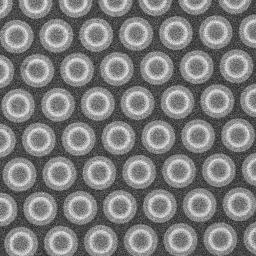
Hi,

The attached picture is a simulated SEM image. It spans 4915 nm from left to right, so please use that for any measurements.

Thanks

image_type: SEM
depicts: an array of small figures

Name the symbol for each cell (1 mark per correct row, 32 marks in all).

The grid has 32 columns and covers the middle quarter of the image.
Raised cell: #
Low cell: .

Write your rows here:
#######..########..########..###
#######..########..########..###
#######..########..########..###
#######...#######...#######...##
######.....#####.....####......#
..###......................##...
......#####.....#####.....#####.
##...#######...#######...#######
##...#######..########..########
###.#########.########..########
###.#########.########..########
##...#######...#######...#######
##...#######...#######...######.
#.....#####......###.......###..
............###.......###......#
.#####.....######...#######...##
#######...#######...#######...##
########..########..########.###
########..########..########.###
########..########..########..##
#######...#######...#######...##
.######....#####.....#####.....#
..###........##.................
.......####......####.....#####.
##....######...#######...#######
###..########..########..#######
###..########..########..#######
###..########..########..#######
###..########..########..#######
###..#######...#######....######
##....#####......####......###..
.......................##.......